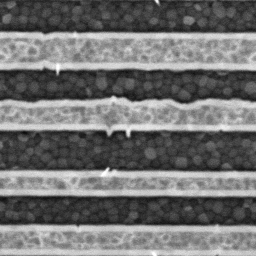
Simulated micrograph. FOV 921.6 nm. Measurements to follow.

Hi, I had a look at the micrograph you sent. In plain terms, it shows one or a few lines or trenches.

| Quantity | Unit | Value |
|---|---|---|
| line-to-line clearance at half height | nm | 131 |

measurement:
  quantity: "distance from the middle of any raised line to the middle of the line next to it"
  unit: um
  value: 0.228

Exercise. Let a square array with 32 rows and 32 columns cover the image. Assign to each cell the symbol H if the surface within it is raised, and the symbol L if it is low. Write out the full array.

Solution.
LLLLLLLLLLLLLLLLLLLLLLLLLLLLLLLL
LLLLLLLLLLLLLLLLLLLLLLLLLLLLLLLL
LLLLLLLLLLLLLLLLLLLLLLLLLLLLLLLL
LLLLLLLLLLLLLLLLLLLLLLLLLLLLLLLL
HHHHHLHHHHHHHHHHHHHHHHHHHHHHHHLL
HHHHHHHHHHHHHHHHHHHHHHHHHHHHHHHH
HHHHHHHHHHHHHHHHHHHHHHHHHHHHHHHH
HHHHHHHHHHHHHHHHHHHHHHHHHHHHHHHH
LLLLLLLLLLLLLLLLLLLLLLLLLLLLLLLL
LLLLLLLLLLLLLLLLLLLLLLLLLLLLLLLL
LLLLLLLLLLLLLLLLLLLLLLLLLLLLLLLL
LLLLLLLLLLLLLLLLLLLLLLLLLLLLLLLL
LLLLLLLLLLLLLLHLLLLLLLLLLLLLLLLL
HHHHHHHHHHHHHHHHHHHHHHHHHHHHHHHH
HHHHHHHHHHHHHHHHHHHHHHHHHHHHHHHH
HHHHHHHHHHHHHHHHHHHHHHHHHHHHHHHH
LLLLLLLLLLLLLLLLLLLLLLLLLLLLLLLL
LLLLLLLLLLLLLLLLLLLLLLLLLLLLLLLL
LLLLLLLLLLLLLLLLLLLLLLLLLLLLLLLL
LLLLLLLLLLLLLLLLLLLLLLLLLLLLLLLL
LLLLLLLLLLLLLLLLLLLLLLLLLLLLLLLL
LLLLLLLLLLLLLLLLLLLLLLLLLLLLLLLL
HHHHHHHHHHHHHHHHHHHHHHHHHHHHHHHH
HHHHHHHHHHHHHHHHHHHHHHHHHHHHHHHH
LLLLLLLLLLLLLLLLLLLLLLLLLLLLLLLL
LLLLLLLLLLLLLLLLLLLLLLLLLLLLLLLL
LLLLLLLLLLLLLLLLLLLLLLLLLLLLLLLL
LLLLLLLLLLLLLLLLLLLLLLLLLLLLLLLL
LLLLHLLLLLHLLLLLLLLLLLLLLLLLLLLL
HHHHHHHHHHHHHHHHHHHHHHHHHHHHHHHH
HHHHHHHHHHHHHHHHHHHHHHHHHHHHHHHH
HHHHHHHHHHHHHHHHHHHHHHHHHHHHHHHH